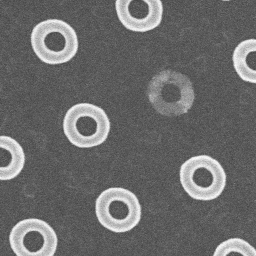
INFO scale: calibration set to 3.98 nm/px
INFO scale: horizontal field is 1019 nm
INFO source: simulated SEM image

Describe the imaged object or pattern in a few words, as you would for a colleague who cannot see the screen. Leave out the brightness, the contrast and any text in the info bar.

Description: ring-shaped raised bodies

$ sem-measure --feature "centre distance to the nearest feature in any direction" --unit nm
358